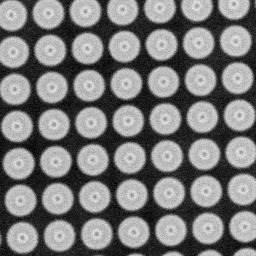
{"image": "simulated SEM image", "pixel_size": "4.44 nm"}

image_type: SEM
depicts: an array of small figures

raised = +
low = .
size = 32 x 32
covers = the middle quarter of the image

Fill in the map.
................................
..............+++.....+++++....+
....+++++....+++++....++++++...+
...+++++++..+++++++..++++++++.++
+..+++++++..+++++++..++++++++.++
+..+++++++..+++++++..++++++++..+
+..+++++++..+++++++...++++++...+
...+++++++...+++++.....++++.....
....+++++.....+++...............
................................
...............++......++++.....
.....++++....++++++...++++++...+
....++++++...++++++...+++++++..+
+..+++++++..++++++++..+++++++..+
+..+++++++..++++++++..+++++++..+
+..++++++++.++++++++..+++++++..+
+..+++++++...++++++....+++++....
+...+++++.....++++......++......
................................
........................+++.....
......+++.....+++++....++++++...
....++++++...+++++++..+++++++..+
+...+++++++..+++++++..++++++++.+
++.++++++++..+++++++..++++++++.+
++.++++++++..+++++++..+++++++...
++..+++++++..+++++++...++++++...
+...++++++....+++++.....+++.....
......+++.......................
................................
.......++......++++.....+++++...
+....+++++....++++++...+++++++..
++..+++++++..++++++++..+++++++..